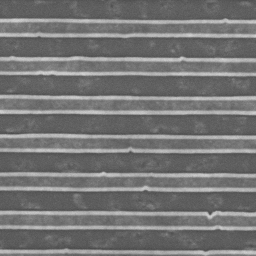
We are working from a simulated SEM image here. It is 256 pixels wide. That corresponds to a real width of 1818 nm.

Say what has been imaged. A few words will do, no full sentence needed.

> parallel lines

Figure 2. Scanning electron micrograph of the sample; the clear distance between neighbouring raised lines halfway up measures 23.6 px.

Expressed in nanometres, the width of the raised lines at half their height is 107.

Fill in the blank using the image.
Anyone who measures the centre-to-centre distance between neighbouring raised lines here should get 273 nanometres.